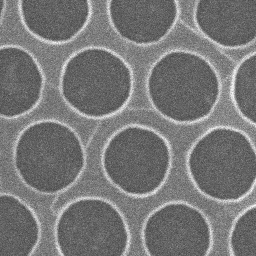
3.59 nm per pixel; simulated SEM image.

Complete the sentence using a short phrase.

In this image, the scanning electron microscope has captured holes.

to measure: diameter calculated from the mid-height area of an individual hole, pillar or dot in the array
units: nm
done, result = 250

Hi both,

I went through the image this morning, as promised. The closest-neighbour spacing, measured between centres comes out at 312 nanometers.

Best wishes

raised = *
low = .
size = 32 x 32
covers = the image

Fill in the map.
.**........***........***.......
***........***........**........
***........***........***.......
***.......****.......****.......
*****....******......*****......
***************************....*
...*******....*******..*********
....*****......*****......*****.
.....***........***........***..
.....***........***........**...
.....***........**.........**...
.....***........***........**...
.....***........***........**...
....*****......****........***..
*.*********..********.....****..
****....************************
***......******....*******....**
**........****......*****......*
**........***........***........
**........***........***........
**........***........***........
**........***........***........
***......*****......****........
****....*******.....*****......*
.*************************....**
...******.....*******..*********
....****.......****......******.
.....**........***........****..
.....**.........**........***...
.....**.........**........***...
....***.........**........***...
....****........***.......***...